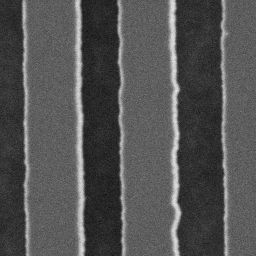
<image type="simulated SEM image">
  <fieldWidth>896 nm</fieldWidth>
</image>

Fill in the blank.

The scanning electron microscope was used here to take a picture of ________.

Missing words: lines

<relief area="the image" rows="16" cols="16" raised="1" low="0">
0111100111100011
0111100111100011
0011100111100011
0011100111100011
0111100011100011
0011100011100011
0011100111100011
0011100111100011
0011100011100011
0011100011100011
0011100011100011
0011100011100011
0011100011100011
0011100011100011
0011100011100011
0011100011100011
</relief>